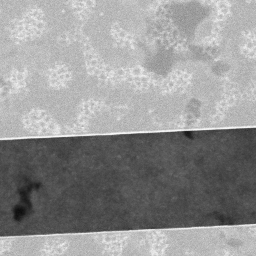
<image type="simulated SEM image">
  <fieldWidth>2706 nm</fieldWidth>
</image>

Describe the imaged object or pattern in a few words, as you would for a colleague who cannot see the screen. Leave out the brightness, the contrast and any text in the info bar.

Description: one or a few lines or trenches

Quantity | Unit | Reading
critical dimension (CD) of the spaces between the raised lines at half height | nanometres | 1040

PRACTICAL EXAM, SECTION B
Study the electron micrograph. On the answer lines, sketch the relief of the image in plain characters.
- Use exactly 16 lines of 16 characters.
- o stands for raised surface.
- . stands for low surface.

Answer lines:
oooooooooooooooo
oooooooooooooooo
oooooooooooooooo
oooooooooooooooo
oooooooooooooooo
oooooooooooooooo
oooooooooooooooo
oooooooooooooooo
oooo............
................
................
................
................
................
.......ooooooooo
oooooooooooooooo